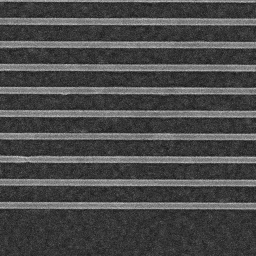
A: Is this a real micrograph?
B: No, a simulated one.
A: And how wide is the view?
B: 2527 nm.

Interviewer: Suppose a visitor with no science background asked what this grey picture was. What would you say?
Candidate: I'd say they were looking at parallel lines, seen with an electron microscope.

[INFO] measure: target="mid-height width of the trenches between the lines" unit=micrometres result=0.167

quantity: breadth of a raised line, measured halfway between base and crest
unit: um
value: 0.0592